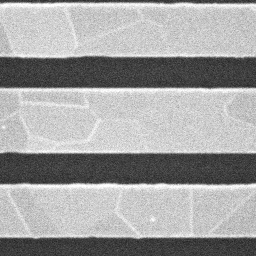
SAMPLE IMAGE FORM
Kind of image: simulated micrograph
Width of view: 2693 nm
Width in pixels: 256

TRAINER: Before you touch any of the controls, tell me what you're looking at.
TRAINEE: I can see lines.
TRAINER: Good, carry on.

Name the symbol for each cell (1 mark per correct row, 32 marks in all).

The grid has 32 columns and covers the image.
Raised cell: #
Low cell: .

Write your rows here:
####..##############..##........
################################
################################
################################
################################
################################
################################
................................
................................
................................
................................
################################
################################
################################
################################
################################
################################
################################
################################
................................
................................
................................
................................
################################
################################
################################
################################
################################
################################
###########.####################
................................
................................